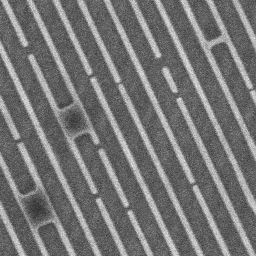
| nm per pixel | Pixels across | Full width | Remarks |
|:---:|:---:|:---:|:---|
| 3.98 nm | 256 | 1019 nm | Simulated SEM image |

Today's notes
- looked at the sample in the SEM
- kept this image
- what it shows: parallel lines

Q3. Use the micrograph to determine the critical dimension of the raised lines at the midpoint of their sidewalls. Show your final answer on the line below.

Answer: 4.4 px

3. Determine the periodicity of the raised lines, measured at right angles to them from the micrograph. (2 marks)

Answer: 92.3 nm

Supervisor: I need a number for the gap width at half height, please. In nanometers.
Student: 74.3